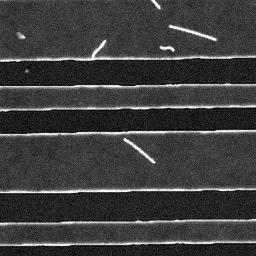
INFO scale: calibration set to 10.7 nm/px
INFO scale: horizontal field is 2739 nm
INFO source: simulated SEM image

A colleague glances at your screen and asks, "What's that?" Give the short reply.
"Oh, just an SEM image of lines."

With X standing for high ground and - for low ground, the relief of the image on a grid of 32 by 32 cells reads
XXXXXXXXXXXXXXXXXXXXXXXXXXXXXXXX
XXXXXXXXXXXXXXXXXXXXXXXXXXXXXXXX
XXXXXXXXXXXXXXXXXXXXXXXXXXXXXXXX
XXXXXXXXXXXXXXXXXXXXXXXXXXXXXXXX
XXXXXXXXXXXXXXXXXXXXXXXXXXXXXXXX
XXXXXXXXXXXXXXXXXXXXXXXXXXXXXXXX
XXXXXXXXXXXXXXXXXXXXXXXXXXXXXXXX
XXX-----------------------------
--------------------------------
--------------------------------
----------------------------X---
XXXXXXXXXXXXXXXXXXXXXXXXXXXXXXXX
XXXXXXXXXXXXXXXXXXXXXXXXXXXXXXXX
XXXXXXXXXXXXXXXXXXX-------------
--------------------------------
--------------------------------
---------------XXXXXXXXXXXXXXXXX
XXXXXXXXXXXXXXXXXXXXXXXXXXXXXXXX
XXXXXXXXXXXXXXXXXXXXXXXXXXXXXXXX
XXXXXXXXXXXXXXXXXXXXXXXXXXXXXXXX
XXXXXXXXXXXXXXXXXXXXXXXXXXXXXXXX
XXXXXXXXXXXXXXXXXXXXXXXXXXXXXXXX
XXXXXXXXXXXXXXXXXXXXXXXXXXXXXXXX
XXXXXXXXXXXXXXXXXXXXXXXXXXXXXXXX
--------------------------------
--------------------------------
--------------------------------
-------------------------------X
XXXXXXXXXXXXXXXXXXXXXXXXXXXXXXXX
XXXXXXXXXXXXXXXXXXXXXXXXXXXXXXXX
XXXXXXXXXXXXXXXXXXX-------------
--------------------------------